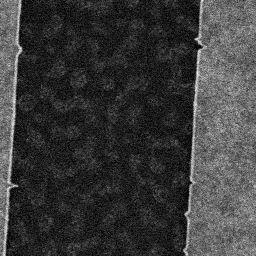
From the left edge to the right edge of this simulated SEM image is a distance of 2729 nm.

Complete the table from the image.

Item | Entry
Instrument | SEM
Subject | one or a few lines or trenches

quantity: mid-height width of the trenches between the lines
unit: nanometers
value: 1930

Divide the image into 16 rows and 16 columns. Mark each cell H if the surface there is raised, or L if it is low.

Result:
HLLLLLLLLLLLLHHH
HLLLLLLLLLLLLHHH
HLLLLLLLLLLLLHHH
HLLLLLLLLLLLHHHH
HLLLLLLLLLLLHHHH
HLLLLLLLLLLLHHHH
HLLLLLLLLLLLHHHH
HLLLLLLLLLLLHHHH
HLLLLLLLLLLLHHHH
HLLLLLLLLLLLHHHH
HLLLLLLLLLLLHHHH
HLLLLLLLLLLLHHHH
LLLLLLLLLLLLHHHH
LLLLLLLLLLLLHHHH
LLLLLLLLLLLLHHHH
LLLLLLLLLLLLHHHH